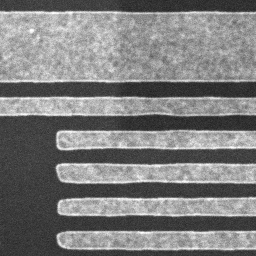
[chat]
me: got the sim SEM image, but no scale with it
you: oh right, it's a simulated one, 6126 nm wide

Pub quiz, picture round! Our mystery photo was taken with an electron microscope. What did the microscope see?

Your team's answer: wiring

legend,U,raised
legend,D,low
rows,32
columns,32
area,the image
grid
DDDDDDDDDDDDDDDDDDDDDDDDDDDDDDDD
DDDDDDDDDDDDDDDDDDDDDDDDDDDDDDDD
UUUUUUUUUUUUUUUUUUUUUUUUUUUUUUUU
UUUUUUUUUUUUUUUUUUUUUUUUUUUUUUUU
UUUUUUUUUUUUUUUUUUUUUUUUUUUUUUUU
UUUUUUUUUUUUUUUUUUUUUUUUUUUUUUUU
UUUUUUUUUUUUUUUUUUUUUUUUUUUUUUUU
UUUUUUUUUUUUUUUUUUUUUUUUUUUUUUUU
UUUUUUUUUUUUUUUUUUUUUUUUUUUUUUUU
UUUUUUUUUUUUUUUUUUUUUUUUUUUUUUUU
DDDDDDDDDDDDDDDDDDDDDDDDDDDDDDDD
DDDDDDDDDDDDDDDDDDDDDDDDDDDDDDDD
UUUUUUUUUUUUUUUUUUUUUUUUUUUUUUUU
UUUUUUUUUUUUUUUUUUUUUUUUUUUUUUUU
DDDDDDDDDDDDDDDDDDDDDDDDDDDDDDDD
DDDDDDDDDDDDDDDDDDDDDDDDDDDDDDDD
DDDDDDDDUUUUUUUUUUUUUUUUUUUUUUUU
DDDDDDDUUUUUUUUUUUUUUUUUUUUUUUUU
DDDDDDDUUUUUDDDDDDDDUUUUUUUDDDDD
DDDDDDDDDDDDDDDDDDDDDDDDDDDDDDDD
DDDDDDDDDDDDDDDDDDDDDDDDDDDDDDDD
DDDDDDDUUUUUUUUUUUUUUUUUUUUUUUUU
DDDDDDDDUUUUUUUUUUUUUUUUUUUUUUUU
DDDDDDDDDDDDDDDDDDDDDDDDDDDDDDDD
DDDDDDDDDDDDDDDDDDDDDDDDDDDDDDDD
DDDDDDDUUUUUUUUUUUUUUUUUUUUUUUUU
DDDDDDDUUUUUUUUUUUUUUUUUUUUUUUUU
DDDDDDDDDDDDDDDDDDDDDDDDDDDDDDDD
DDDDDDDDDDDDDDDDDDDDDDDDDDDDDDDD
DDDDDDDUUUUUUUUUUUUUUUUUUUUUUUUU
DDDDDDDUUUUUUUUUUUUUUUUUUUUUUUUU
DDDDDDDDDDDDDDDDDDDDDDDDDDDDDDDD